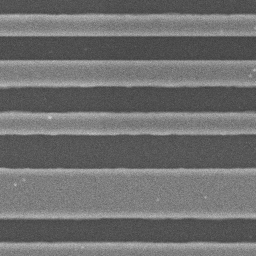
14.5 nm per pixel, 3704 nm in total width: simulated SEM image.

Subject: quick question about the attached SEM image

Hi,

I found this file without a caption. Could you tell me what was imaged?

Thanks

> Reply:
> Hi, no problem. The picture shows lines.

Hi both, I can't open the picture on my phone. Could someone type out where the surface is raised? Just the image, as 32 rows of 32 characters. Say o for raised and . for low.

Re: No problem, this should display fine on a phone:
................................
................................
oooooooooooooooooooooooooooooooo
oooooooooooooooooooooooooooooooo
................................
................................
................................
................................
oooooooooooooooooooooooooooooooo
oooooooooooooooooooooooooooooooo
oooooooooooooooooooooooooooooooo
................................
................................
................................
oooooooooooooooooooooooooooooooo
oooooooooooooooooooooooooooooooo
oooooooooooooooooooooooooooooooo
................................
................................
................................
................................
oooooooooooooooooooooooooooooooo
oooooooooooooooooooooooooooooooo
oooooooooooooooooooooooooooooooo
oooooooooooooooooooooooooooooooo
oooooooooooooooooooooooooooooooo
oooooooooooooooooooooooooooooooo
................................
................................
................................
oooooo.ooooooooooooooo.ooooo.oo.
oooooooooooooooooooooooooooooooo